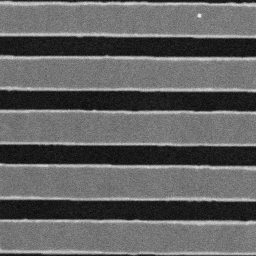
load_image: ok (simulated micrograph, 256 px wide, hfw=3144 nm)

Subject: lines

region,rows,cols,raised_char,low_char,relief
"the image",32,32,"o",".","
oooooooooooooooooooooooooooooooo
oooooooooooooooooooooooooooooooo
oooooooooooooooooooooooooooooooo
oooooooooooooooooooooooooooooooo
................oooooooooooooooo
................................
................................
oooooooooooooooooooooooooooooooo
oooooooooooooooooooooooooooooooo
oooooooooooooooooooooooooooooooo
oooooooooooooooooooooooooooooooo
................................
................................
................................
oooooooooooooooooooooooooooooooo
oooooooooooooooooooooooooooooooo
oooooooooooooooooooooooooooooooo
oooooooooooooooooooooooooooooooo
................................
................................
o...............................
oooooooooooooooooooooooooooooooo
oooooooooooooooooooooooooooooooo
oooooooooooooooooooooooooooooooo
oooooooooooooooooooooooooooooooo
................................
................................
................................
oooooooooooooooooooooooooooooooo
oooooooooooooooooooooooooooooooo
oooooooooooooooooooooooooooooooo
oooooooooooooooooooooooooooooooo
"